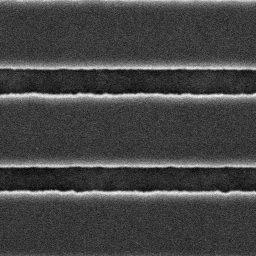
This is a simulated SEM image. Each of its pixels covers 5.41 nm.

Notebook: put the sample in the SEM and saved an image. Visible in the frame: lines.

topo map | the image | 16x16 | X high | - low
XXXXXXXXXXXXXXXX
XXXXXXXXXXXXXXXX
XXXXXXXXXXXXXXXX
XXXXXXXXXXXXXXXX
----------------
----------------
XXXXXXXXXXXXXXXX
XXXXXXXXXXXXXXXX
XXXXXXXXXXXXXXXX
XXXXXXXXXXXXXXXX
----------------
----------------
XXXXXXXXXXXXXXXX
XXXXXXXXXXXXXXXX
XXXXXXXXXXXXXXXX
XXXXXXXXXXXXXXXX